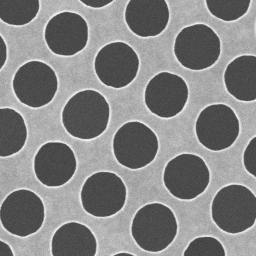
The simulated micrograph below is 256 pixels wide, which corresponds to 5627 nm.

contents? a regular array of holes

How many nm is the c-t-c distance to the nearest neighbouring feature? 1270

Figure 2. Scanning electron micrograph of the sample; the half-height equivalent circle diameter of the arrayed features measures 1 microns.